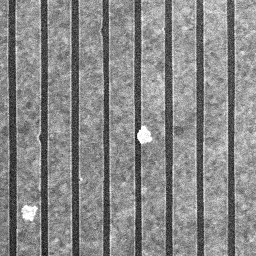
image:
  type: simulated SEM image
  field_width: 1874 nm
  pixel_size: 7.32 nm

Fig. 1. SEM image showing parallel lines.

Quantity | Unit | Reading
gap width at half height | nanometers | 57.6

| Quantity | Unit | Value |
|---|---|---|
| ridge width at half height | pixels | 23.9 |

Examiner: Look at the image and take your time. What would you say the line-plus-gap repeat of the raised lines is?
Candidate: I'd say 228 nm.